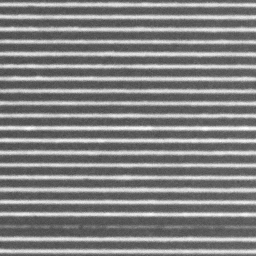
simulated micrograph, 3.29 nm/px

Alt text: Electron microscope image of parallel lines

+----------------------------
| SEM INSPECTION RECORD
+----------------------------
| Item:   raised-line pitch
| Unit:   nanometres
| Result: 40.5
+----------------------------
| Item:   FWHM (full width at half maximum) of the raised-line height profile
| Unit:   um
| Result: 0.0078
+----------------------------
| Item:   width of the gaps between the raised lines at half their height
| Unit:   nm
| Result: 32.9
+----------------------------